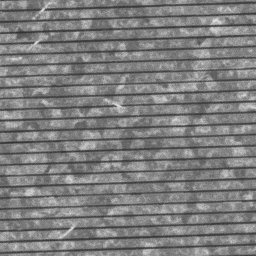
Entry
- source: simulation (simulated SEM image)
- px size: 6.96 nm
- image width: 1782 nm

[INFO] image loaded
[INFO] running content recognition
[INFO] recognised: parallel lines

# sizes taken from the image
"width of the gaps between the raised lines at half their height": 17.4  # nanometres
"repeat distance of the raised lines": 76.5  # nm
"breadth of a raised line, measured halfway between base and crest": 0.0583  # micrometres